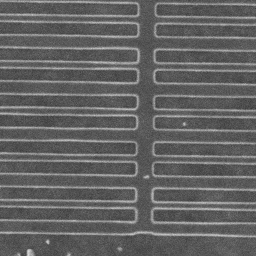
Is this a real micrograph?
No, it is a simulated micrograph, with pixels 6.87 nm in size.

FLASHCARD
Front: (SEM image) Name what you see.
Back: groups of lines, slits or small figures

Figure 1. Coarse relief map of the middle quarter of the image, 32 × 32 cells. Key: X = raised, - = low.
XXXXXXXXXXXXXXXXXXXXXXXXXXXXXXXX
------------------XXXXXX----XXXX
-------------------XXXX---------
-------------------XXXX---------
XXX---------------XXXXX---------
XXXXXXXXXXXXXXXXXXXXXXXXXXXXXXXX
XXXXXXXXXXXXXXXXXXXXXXXXXXXXXXXX
XXXXXXXXXXXXXXXXXXXXXXXXXXXXXXXX
------------------XXXXX---------
-------------------XXXX---------
------------------XXXXX---------
XXXXXXXXXXXXXXXXXXXXXXXXXXXXXX--
XXXXXXXXXXXXXXXXXXXXXXXXXXXXXXXX
------------------XXXXX---------
------------------XXXXX---------
------------------XXXXX---------
XXXXXXXXXXXXXXXXXXXXXXXXX-------
XXXXXXXXXXXXXXXXXXXXXXXXXXXXXXXX
XXXXXXXXXXXXXXXXXXXXXXXXXXXXXXXX
---------------XXXXXXXXXXXXXXXXX
------------------XXXXX---------
------------------XXXX----------
------------------XXXXX---------
XXXXXXXXXXXXXXXXXXXXXXXXXXXXXXXX
------------XXXXXXXXXXXXXXXXXXXX
------------------XXXX----------
------------------XXXX----------
------------------XXXXX---------
XXXXXXXXXXXXXXXXXXXXXXXXXXXXXXXX
XXXXXXXXXXXXXXXXXXXXXXXXXXXXXXXX
XXXXXXXXXXXXXXXXXXXXXXXXXXXXXXXX
------------------XXXXX---------